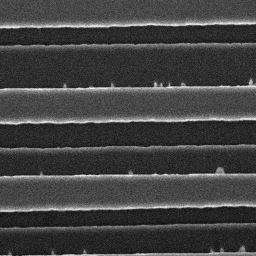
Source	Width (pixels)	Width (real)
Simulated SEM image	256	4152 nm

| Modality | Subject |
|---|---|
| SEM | lines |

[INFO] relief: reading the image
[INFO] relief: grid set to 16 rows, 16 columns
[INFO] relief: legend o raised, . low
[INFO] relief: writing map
oooooooooooooooo
ooooooooooooo...
................
................
................
..........oooooo
oooooooooooooooo
ooooooooooooo.o.
................
................
................
oooooooooooooooo
oooooooooooooooo
................
................
................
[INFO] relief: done